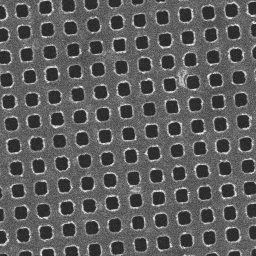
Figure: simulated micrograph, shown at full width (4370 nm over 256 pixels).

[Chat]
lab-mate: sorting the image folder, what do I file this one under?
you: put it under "a regular array of holes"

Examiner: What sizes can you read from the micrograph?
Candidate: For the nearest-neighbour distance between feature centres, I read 22.2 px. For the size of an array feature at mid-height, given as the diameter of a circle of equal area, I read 232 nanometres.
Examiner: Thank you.